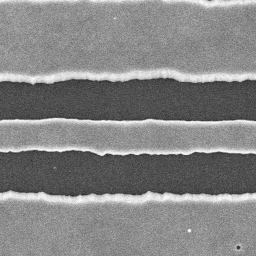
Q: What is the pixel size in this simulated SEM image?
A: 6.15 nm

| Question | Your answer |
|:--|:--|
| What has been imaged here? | lines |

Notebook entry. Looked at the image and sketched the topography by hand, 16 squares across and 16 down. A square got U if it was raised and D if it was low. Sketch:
UUUUUUUUUUUUUUUU
UUUUUUUUUUUUUUUU
UUUUUUUUUUUUUUUU
UUUUUUUUUUUUUUUU
UUUUUUUUUUUUUUUU
DDDDDDDDDDDDDDDD
DDDDDDDDDDDDDDDD
DDDUUDDDDUDDDDDD
UUUUUUUUUUUUUUUU
DDDDDDUUUUUUUUUU
DDDDDDDDDDDDDDDD
DDDDDDDDDDDDDDDD
UUUUUUUUUUUUUUUU
UUUUUUUUUUUUUUUU
UUUUUUUUUUUUUUUU
UUUUUUUUUUUUUUUU